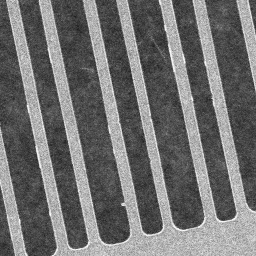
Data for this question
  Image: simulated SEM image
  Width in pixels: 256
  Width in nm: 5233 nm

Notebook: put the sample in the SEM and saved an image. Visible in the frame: parallel lines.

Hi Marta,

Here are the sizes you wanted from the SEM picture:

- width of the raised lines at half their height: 11.3 pixels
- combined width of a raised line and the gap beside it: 757 nm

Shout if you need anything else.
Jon